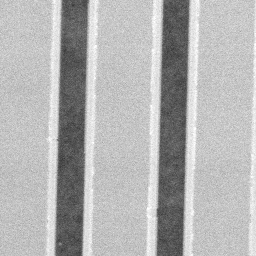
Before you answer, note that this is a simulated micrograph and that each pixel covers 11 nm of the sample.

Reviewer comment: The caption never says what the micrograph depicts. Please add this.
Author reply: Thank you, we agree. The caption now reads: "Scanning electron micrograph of one or a few lines or trenches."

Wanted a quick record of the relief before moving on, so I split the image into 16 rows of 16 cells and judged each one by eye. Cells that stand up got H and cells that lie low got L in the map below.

HHHHLLHHHHLLHHHH
HHHLLLHHHHLLHHHH
HHHLLLHHHHLLHHHH
HHHLLLHHHHLLHHHH
HHHLLLHHHHLLHHHH
HHHLLLHHHHLLHHHH
HHHLLLHHHHLLHHHH
HHHLLLHHHHLLHHHH
HHHLLLHHHHLLHHHH
HHHLLLHHHHLLHHHH
HHHLLLHHHHLLHHHH
HHHLLLHHHHLLHHHH
HHHLLLHHHHLLHHHH
HHHLLHHHHLLLHHHH
HHHLLHHHHLLLHHHH
HHHLLHHHHLLLHHHH